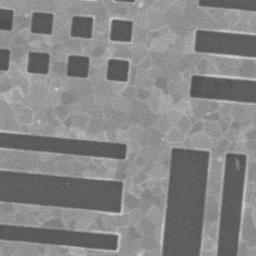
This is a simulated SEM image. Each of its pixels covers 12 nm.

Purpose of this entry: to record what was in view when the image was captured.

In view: groups of lines, slits or small figures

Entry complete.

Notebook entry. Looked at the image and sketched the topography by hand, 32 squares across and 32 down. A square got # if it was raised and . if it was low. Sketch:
#########################.......
..##############################
..##...##...##..################
..##...##...##...###############
#########..###...#######........
########################........
.###.####################.......
.##...##...###..################
.##...##...##...################
#########..##...########...#####
########################........
########################........
###########################.....
################################
################################
################################
.###############################
...........#####################
................################
##########......#####.....##...#
#####################.....##...#
...##################.....##...#
..............#######.....##...#
...............######.....##...#
...............######.....##...#
###............######.....##..##
############...######.....#...##
#####################....##...##
......##############.....##...##
...............#####.....##...##
#####..........#####.....##...##
####################.....##...##